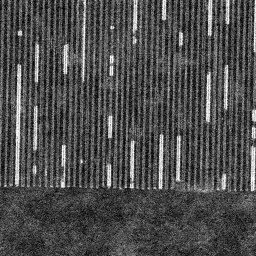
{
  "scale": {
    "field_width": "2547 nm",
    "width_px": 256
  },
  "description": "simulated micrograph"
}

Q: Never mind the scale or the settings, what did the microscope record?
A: parallel lines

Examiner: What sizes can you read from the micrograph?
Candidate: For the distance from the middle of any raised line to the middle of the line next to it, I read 57.2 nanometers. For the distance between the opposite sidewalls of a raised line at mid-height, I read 22.4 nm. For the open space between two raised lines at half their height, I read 3.87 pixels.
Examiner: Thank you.